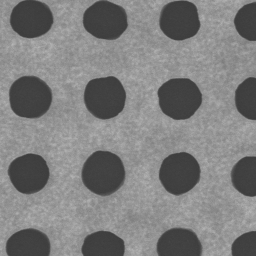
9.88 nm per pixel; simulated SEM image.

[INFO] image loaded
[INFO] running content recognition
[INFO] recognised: holes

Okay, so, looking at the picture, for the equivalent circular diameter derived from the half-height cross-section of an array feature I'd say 422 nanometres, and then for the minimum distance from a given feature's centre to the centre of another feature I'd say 74.4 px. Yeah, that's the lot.